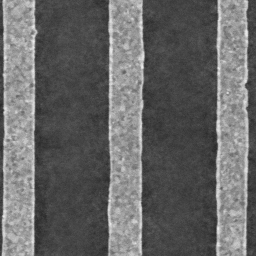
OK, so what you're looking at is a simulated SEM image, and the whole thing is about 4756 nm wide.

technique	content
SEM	one or a few lines or trenches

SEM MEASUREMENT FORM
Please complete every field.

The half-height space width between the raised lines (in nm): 1420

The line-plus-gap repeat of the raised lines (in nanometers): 1980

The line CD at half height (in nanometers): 553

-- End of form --